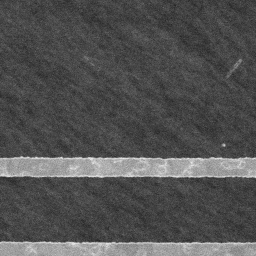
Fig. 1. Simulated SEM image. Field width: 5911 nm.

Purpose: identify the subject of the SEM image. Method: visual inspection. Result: one or a few lines or trenches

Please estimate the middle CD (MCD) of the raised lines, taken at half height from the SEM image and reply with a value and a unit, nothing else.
418 nm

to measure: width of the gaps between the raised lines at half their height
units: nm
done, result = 1530